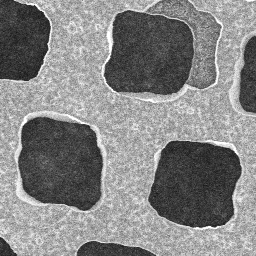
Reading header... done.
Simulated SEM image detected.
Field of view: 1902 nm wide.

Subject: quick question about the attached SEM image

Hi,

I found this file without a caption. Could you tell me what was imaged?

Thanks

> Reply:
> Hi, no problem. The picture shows holes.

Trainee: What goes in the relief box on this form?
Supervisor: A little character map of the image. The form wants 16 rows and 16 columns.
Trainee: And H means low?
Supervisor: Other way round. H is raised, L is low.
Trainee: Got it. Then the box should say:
LLHHHHHHHLLLHHHH
LLLHHHHLLLLLLLHH
LLLHHHHLLLLLLLHL
LLLHHHHLLLLLLHHL
LLHHHHHLLLLLLHHL
HHHHHHHLLLLLLHHL
HHHHHHHHHHHHHHHL
HHLLLHHHHHHHHHHH
HLLLLLHHHHHHHHHH
HLLLLLHHHHLLLLLH
HLLLLLHHHHLLLLLH
HLLLLLHHHHLLLLLH
HHLLLLHHHLLLLLLH
HHHHHHHHHHLLLLLH
HHHHHHHHHHHHHHHH
LHHHHLLLLHHHHHHH